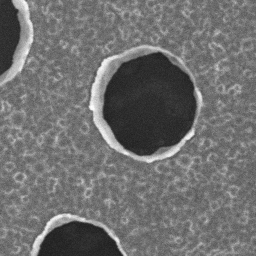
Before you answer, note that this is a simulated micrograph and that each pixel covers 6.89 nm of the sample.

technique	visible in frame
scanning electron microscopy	holes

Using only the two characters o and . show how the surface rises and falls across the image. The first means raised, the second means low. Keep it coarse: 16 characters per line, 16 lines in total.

.ooooooooooooooo
..oooooooooooooo
..oooooooooooooo
.ooooooo...ooooo
.oooooo.....oooo
ooooooo.....oooo
oooooo......oooo
ooooooo.....oooo
ooooooo.....oooo
oooooooo..oooooo
oooooooooooooooo
oooooooooooooooo
oooooooooooooooo
oooooooooooooooo
ooo....ooooooooo
oo.....ooooooooo